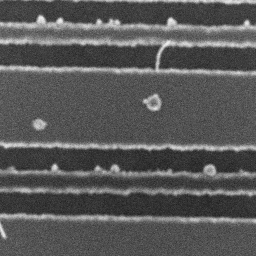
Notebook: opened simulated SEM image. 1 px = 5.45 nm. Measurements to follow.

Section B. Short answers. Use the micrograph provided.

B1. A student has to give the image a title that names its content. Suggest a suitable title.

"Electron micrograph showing lines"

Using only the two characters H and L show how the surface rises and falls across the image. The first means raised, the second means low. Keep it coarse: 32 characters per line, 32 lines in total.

LLLLLLLLLLLLLLLLLLLLLLLLLLLLLLLL
LLLLLLLLLLLLLLLLLLLLLLLLLLLLLLLL
LLLLLHLLLLLLLLLLLLLLLHLLLLLLLLLL
HHHHHHHHHHHHHHHHHHHHHHHHHHHHHHHH
HHHHHHHHHHHHHHHHHHHHHHHHHHHHHHHH
LLLLLLLLLLLLLLHHHLLLHHHHHHHHHHHH
LLLLLLLLLLLLLLLLLLLLLLLLLLLLLLLL
LLLLLLLLLLLLLLLLLLLLLLLLLLLLLLLL
HHHHHLHLHHLLLLLLLLLLLLLLLLLLLLLL
HHHHHHHHHHHHHHHHHHHHHHHHHHHHHHHH
HHHHHHHHHHHHHHHHHHHHHHHHHHHHHHHH
HHHHHHHHHHHHHHHHHHHHHHHHHHHHHHHH
HHHHHHHHHHHHHHHHHHHHHHHHHHHHHHHH
HHHHHHHHHHHHHHHHHHHHHHHHHHHHHHHH
HHHHHHHHHHHHHHHHHHHHHHHHHHHHHHHH
HHHHHHHHHHHHHHHHHHHHHHHHHHHHHHHH
HHHHHHHHHHHHHHHHHHHHHHHHHHHHHHHH
HHHHHHHHHHHHHHHHHHHHHHHHHHHHHHHH
LLLLLLLLLLLLLLLHLLHHLLHHHHHHHHHH
LLLLLLLLLLLLLLLLLLLLLLLLLLLLLLLL
LLLLLLLLLLLLLLLLLLLLLLLLLLLLLLLL
HHHHHHHHLLLHHHHLLLLLLLLLLHHLLLLL
HHHHHHHHHHHHHHHHHHHHHHHHHHHHHHHH
HHHHHHHHHHHHHHHHHHHHHHHHHHHHHHHH
LLLLLLLLLLLLLLLLLLLLLLLLLLLLLLLL
LLLLLLLLLLLLLLLLLLLLLLLLLLLLLLLL
LLLLLLLLLLLLLLLLLLLLLLLLLLLLLLLL
HHHHHHHHHHHHHHHHHHHHHHHHHHHHHHHH
HHHHHHHHHHHHHHHHHHHHHHHHHHHHHHHH
HHHHHHHHHHHHHHHHHHHHHHHHHHHHHHHH
HHHHHHHHHHHHHHHHHHHHHHHHHHHHHHHH
HHHHHHHHHHHHHHHHHHHHHHHHHHHHHHHH